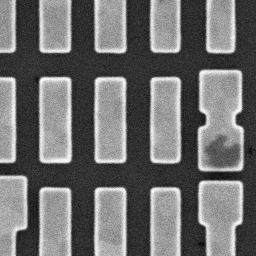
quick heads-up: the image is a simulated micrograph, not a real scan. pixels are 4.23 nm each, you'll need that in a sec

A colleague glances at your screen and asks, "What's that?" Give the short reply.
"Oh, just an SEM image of wiring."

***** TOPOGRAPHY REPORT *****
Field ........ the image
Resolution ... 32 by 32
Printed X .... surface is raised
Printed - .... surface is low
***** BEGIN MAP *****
XX---XXXX---XXXX---XXX----XXX---
XX---XXXX---XXXX---XXX----XXX---
XX---XXXX---XXXX---XXX----XXX---
XX---XXXX---XXXX---XXX----XXX---
XX---XXXX---XXXX---XXXX---XXX---
XX---XXXX---XXXX---XXX----XXX---
--------------X-----------XXX---
--------------------------------
--------------------------------
-------------------------XXXXX--
XX---XXXX---XXXX---XXXX--XXXXX--
XX---XXXX---XXXX---XXXX--XXXXX--
XX---XXXX---XXXX---XXX---XXXXX--
XX---XXXX---XXXX---XXX---XXXXX--
XX---XXXX---XXXX---XXX----XXX---
XX---XXXX---XXXX---XXXX---XXXX--
XX---XXXX---XXXX---XXXX--XXXXX--
XX---XXXX---XXXX---XXXX--XXXXX--
XX---XXXX---XXXX---XXXX--XXXXX--
XX---XXXX---XXXX---XXXX--XXXXX--
-------------------------XXXXX--
--------------------------------
XXX-----------------------------
XXX----------------------XXXXX--
XXX--XXXX---XXXX---XXXX--XXXXX--
XXX--XXXX---XXXX---XXXX--XXXXX--
XXX--XXXX---XXXX---XXXX--XXXXX--
XXX--XXXX---XXXX---XXXX--XXXXX--
XXX--XXXX---XXXX---XXXX---XXX---
XX---XXXX---XXXX---XXX----XXX---
XX---XXXX---XXXX---XXX----XXX---
XX---XXXX---XXXX---XXX----XXX---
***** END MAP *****